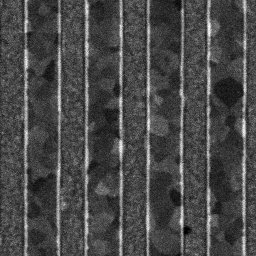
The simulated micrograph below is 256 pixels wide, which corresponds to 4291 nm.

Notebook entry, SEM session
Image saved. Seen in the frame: one or a few lines or trenches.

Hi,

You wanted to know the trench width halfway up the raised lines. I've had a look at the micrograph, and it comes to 0.434 um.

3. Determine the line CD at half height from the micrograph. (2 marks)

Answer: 590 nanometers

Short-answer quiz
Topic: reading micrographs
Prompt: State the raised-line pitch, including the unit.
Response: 61.4 pixels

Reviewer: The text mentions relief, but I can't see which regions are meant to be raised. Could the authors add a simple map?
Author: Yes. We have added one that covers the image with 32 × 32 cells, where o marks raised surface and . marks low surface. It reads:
...oooo....oooo....oooo...ooooo.
...oooo....oooo....oooo...ooooo.
...oooo....oooo....oooo...ooooo.
...oooo....oooo....oooo...ooooo.
...oooo....oooo....oooo...ooooo.
...oooo....oooo....oooo...ooooo.
...oooo....oooo....oooo...ooooo.
...oooo....oooo....oooo...ooooo.
...oooo....oooo....oooo...ooooo.
...oooo....oooo....oooo...ooooo.
...oooo....oooo....oooo...ooooo.
...oooo....oooo....oooo...ooooo.
...oooo....oooo....oooo...ooooo.
...oooo....oooo....oooo...ooooo.
...oooo....oooo....oooo...ooooo.
...oooo....oooo....oooo...ooooo.
...oooo....oooo....oooo...ooooo.
...oooo....oooo....oooo...ooooo.
...oooo....oooo....oooo...ooooo.
...oooo....oooo...ooooo...ooooo.
...oooo....oooo...ooooo...ooooo.
...oooo....oooo...ooooo...ooooo.
...oooo....oooo...ooooo...ooooo.
...oooo....oooo...ooooo...ooooo.
...oooo....oooo...ooooo...ooooo.
...oooo....oooo...ooooo...ooooo.
...oooo....oooo...ooooo...ooooo.
...oooo....oooo...ooooo...ooooo.
...oooo....oooo...ooooo...ooooo.
...oooo....oooo...ooooo...ooooo.
...oooo....oooo...ooooo...ooooo.
...oooo....oooo...ooooo...ooooo.